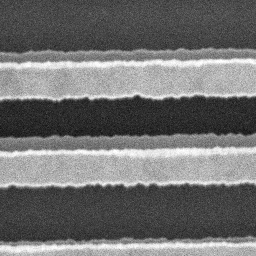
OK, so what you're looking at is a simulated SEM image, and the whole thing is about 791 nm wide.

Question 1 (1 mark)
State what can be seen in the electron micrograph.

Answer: lines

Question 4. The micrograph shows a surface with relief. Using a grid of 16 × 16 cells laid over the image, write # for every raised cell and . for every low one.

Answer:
................
................
................
################
################
################
................
................
.........#######
################
################
###########.###.
................
................
................
################